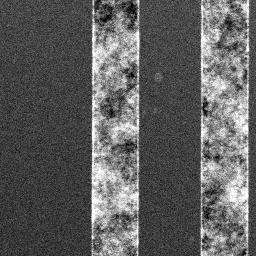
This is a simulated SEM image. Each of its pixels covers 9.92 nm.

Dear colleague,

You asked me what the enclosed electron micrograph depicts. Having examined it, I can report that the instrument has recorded one or a few lines or trenches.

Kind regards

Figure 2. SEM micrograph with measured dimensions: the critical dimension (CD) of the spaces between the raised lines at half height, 635 nanometres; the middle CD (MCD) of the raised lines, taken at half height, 0.446 micrometres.